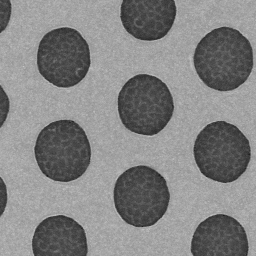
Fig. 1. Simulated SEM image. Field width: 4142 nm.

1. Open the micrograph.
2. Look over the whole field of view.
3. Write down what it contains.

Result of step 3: holes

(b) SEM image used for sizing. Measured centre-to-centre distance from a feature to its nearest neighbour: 1460 nanometres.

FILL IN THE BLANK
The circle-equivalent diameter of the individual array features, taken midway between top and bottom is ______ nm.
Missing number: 956